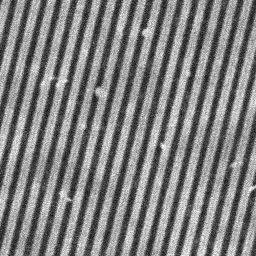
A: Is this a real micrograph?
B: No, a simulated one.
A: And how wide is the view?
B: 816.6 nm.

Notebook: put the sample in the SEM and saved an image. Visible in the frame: parallel lines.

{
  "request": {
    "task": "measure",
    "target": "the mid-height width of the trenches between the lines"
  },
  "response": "26 nanometres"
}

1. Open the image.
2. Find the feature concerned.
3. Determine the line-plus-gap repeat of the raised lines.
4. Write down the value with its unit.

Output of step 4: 46.8 nanometres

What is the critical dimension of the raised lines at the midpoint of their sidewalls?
0.0202 um